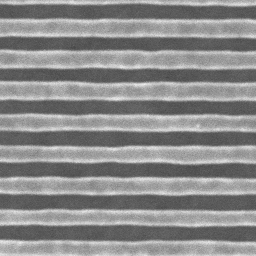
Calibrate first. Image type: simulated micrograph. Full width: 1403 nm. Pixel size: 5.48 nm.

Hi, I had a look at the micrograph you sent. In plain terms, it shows wiring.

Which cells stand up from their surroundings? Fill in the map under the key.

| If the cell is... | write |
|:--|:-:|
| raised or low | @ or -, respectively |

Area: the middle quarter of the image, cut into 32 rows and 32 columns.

@@@@@@@@@@@@@@@@@@@@@@@@@@@@@@@@
--------------------------------
--------------------------------
--------------------------------
--------------------------------
@@@@@@@@@@@@@@@@@@@@@@@@@@@@@@@@
@@@@@@@@@@@@@@@@@@@@@@@@@@@@@@@@
@@@@@@@@@@@@@@@@@@@@@@@@@@@@@@@@
@@@@@@@@@@@@@@@@@@@@@@@@@@@@@@@@
--------------------------------
--------------------------------
--------------------------------
--------------------------------
@@@@@@@@@@@@@@@@@@@@@@@@@@@@@@@@
@@@@@@@@@@@@@@@@@@@@@@@@@@@@@@@@
@@@@@@@@@@@@@@@@@@@@@@@@@@@@@@@@
--------------@@@@@@@@@@@@@@@@@@
--------------------------------
--------------------------------
--------------------------------
--------------------------------
@@@@@@@@@@@@@@@@@@@@@@@@@@@@@@@@
@@@@@@@@@@@@@@@@@@@@@@@@@@@@@@@@
@@@@@@@@@@@@@@@@@@@@@@@@@@@@@@@@
----------------------------@@@@
--------------------------------
--------------------------------
--------------------------------
--------------------------------
@@@@@@@@@@@@@@@@@@@@@@@@@@@@@@@@
@@@@@@@@@@@@@@@@@@@@@@@@@@@@@@@@
@@@@@@@@@@@@@@@@@@@@@@@@@@@@@@@@